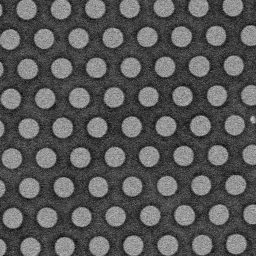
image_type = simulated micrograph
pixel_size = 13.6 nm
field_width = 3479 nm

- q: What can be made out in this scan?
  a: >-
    an array of small figures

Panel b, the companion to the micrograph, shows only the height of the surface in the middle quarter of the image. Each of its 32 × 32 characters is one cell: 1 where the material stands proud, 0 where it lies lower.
11000011110000111110000111110001
11000011110000111110000111110001
11000011110000011100000011100000
00000000000000000000000000000000
00000000000000000000000000000000
00000000000000000000000000000000
00111000000111000001111000001110
01111100001111100001111000011111
01111100001111100001111000011111
00111100001111100001111000001111
00111000000111000000000000000000
00000000000000000000000000000000
00000000000000000000000000000000
00000000000000001100000011100000
11000011110000011110000111110000
11000011111000011110000111110000
11000011111000011110000111110000
11000011110000011110000011100000
00000000000000000000000000000000
00000000000000000000000000000000
00000000000000000000000000000000
00011100000111000001111000001111
00111100001111100001111100001111
00111100001111100001111100001111
00111100000111100001111000001111
00011000000011000000110000000000
00000000000000000000000000000000
00000000000000000000000000000000
00000000100000001100000011100000
11000001111000011110000011110000
11000011111000011110000111110000
11000011111000011110000011110000